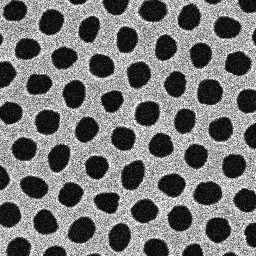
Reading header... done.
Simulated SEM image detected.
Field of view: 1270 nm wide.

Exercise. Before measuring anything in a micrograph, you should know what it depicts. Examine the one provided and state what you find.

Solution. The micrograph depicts a regular array of holes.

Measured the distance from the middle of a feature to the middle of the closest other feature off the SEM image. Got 180 nm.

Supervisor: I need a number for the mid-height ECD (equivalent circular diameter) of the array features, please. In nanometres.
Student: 124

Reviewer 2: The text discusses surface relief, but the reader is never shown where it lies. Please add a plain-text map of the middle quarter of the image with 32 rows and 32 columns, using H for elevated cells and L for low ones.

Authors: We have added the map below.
LLHHHHLLLLLLLHHHLLLLLHHHHHHHHHHH
HHHHHHLLLLLLLHHHLLLLLLHHHHHHHHHH
HHHHHHHLLLLLHHHHLLLLLLHHHHHLLLHH
HHHHHHHHHHHHHHHHLLLLLLHHHHLLLLHH
HHLLHHHHHHHHHHHHLLLLLHHHHLLLLLLH
LLLLLHHHHHHHHHHHHLLLHHHHHLLLLLHH
LLLLLHHHHHHHHHHHHHHHHHHHHLLLLLHH
LLLLLHHHHHLLLLLHHHHHHHHHHHLLLLHH
LLLLLHHHHLLLLLLHHHHHHHHHHHHHHHHH
LLLLLHHHHLLLLLLHHHHLLLLHHHHHHHHH
HLLLHHHHHHLLLLHHHHLLLLLLHHHHHHHH
HHHHHHHHHHLLLHHHHHLLLLLLHHHHHLLL
HHHHHHHHHHHHHHHHHHLLLLLLHHHHLLLL
HHHHLLLHHHHHHHHHHHLLLLLLHHHHLLLL
HHHHLLLLHHHHHHHHHHLLLLLHHHHLLLLL
HHHLLLLLLHHHHHHHHHHHLLHHHHHHLLLL
HHHLLLLLLHHHLLLLLHHHHHHHHHHHLLLL
HHHLLLLLHHHHLLLLLLHHHHHLLHHHHLHH
HHHLLLLLHHHHLLLLLLHHHHLLLLLHHHHH
HHHHLLHHHHHHLLLLLLHHHLLLLLLHHHHH
LHHHHHHHHHHHHLLLLHHHHLLLLLLHHHHL
LLHHHHHHHHHHHHLLHHHHHLLLLLLHHHLL
LLHHHHHHHHHHHHHHHHHHHHLLLLLHHHLL
LHHHHHLLLLHHHHHHHHHHHHHHLHHHHHLL
LHHHHLLLLLLHHHHHHLLLHHHHHHHHHHLL
LHHHHLLLLLLHHHHLLLLLHHHHHHHHHHHL
HHHHHLLLLLLHHHHLLLLLHHHHHHHHHHHH
HHHHHHLLLLHHHHLLLLLLHHHHHHHLHHHH
HHHHHHHLLHHHHHLLLLLLHHHHLLLLLLHH
HHHHHHHHHHHHHHLLLLLHHHHHLLLLLLHH
LLLLHHHHHHHHHHHLLLLHHHHLLLLLLLHH
LLLLLHHHHHHHHHHHLHHHHHHHLLLLLLHH